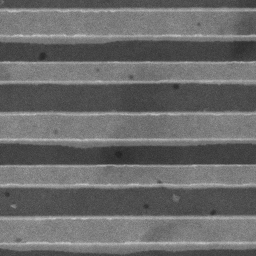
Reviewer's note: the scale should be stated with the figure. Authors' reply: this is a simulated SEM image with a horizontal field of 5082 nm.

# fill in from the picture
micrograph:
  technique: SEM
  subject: lines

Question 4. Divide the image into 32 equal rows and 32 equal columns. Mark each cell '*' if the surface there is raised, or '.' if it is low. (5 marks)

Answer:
................................
********************************
********************************
********************************
********************************
................................
................................
................................
********************************
********************************
................................
................................
................................
................................
********************************
********************************
********************************
********************************
................................
................................
................................
********************************
********************************
................................
................................
................................
................................
********************************
********************************
********************************
********************************
................................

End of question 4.